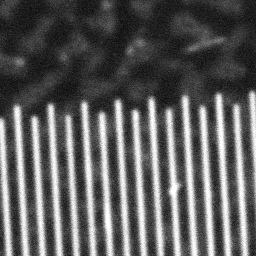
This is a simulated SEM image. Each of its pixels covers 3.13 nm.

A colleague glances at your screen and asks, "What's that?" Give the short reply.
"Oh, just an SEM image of parallel lines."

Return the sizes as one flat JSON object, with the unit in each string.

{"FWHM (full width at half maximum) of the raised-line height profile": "9 nm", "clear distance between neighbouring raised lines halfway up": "43.4 nanometers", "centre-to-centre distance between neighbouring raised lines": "52.8 nanometers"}